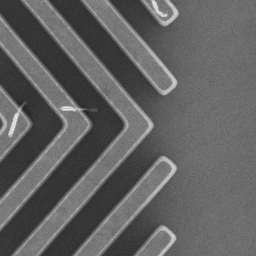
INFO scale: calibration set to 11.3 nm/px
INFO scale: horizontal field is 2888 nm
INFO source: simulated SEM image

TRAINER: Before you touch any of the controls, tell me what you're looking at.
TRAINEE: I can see groups of lines, slits or small figures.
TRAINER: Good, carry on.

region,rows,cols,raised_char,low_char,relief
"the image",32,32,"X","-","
---XXX-----XXX----XXX-----------
----XXX----XXXX----XXX----------
-----XXX----XXXX----X-----------
X-----XXX----XXX----------------
XX-----XXX----XXX---------------
XXX----XXXX----XXX--------------
-XXX----XXX-----XXX-------------
--XXX----XXX-----XXX------------
--XXXX----XXX----XXXX-----------
---XXX-----XXX----XXX-----------
----XXX-----XXX----XXX----------
X----XXX----XXXX----X-----------
XX----XXX----XXXX---------------
XX-----XXX----XXX---------------
XXX----XXXX----XXX--------------
-XXX----XXX-----XXX-------------
XXX-----XXX----XXX--------------
XX-----XXX----XXXX--------------
X-----XXX-----XXX---------------
X----XXX-----XXX----------------
----XXX-----XXX----XXX----------
---XXX-----XXX----XXXX----------
--XXXX----XXX-----XXX-----------
-XXXX----XXX-----XXX------------
-XXX----XXX-----XXX-------------
XXX----XXXX----XXX--------------
XX----XXXX----XXX---------------
X-----XXX----XXX----------------
-----XXX----XXXX----------------
----XXX----XXXX----XXX----------
---XXX----XXXX----XXX-----------
--XXX-----XXX----XXX------------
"